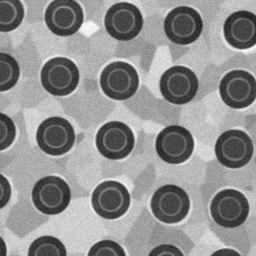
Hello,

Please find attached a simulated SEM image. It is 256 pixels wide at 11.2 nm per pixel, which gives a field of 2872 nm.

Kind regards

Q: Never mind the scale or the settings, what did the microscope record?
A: an array of small figures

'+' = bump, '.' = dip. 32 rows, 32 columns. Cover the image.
...+++....++++...+++++++++++++++
...+++.....++.....+++....++++..+
...+++.....++.....+++....+++....
..++++....+++.....+++....+++....
++++++++.+++++...++++....+++....
++++++++++++++++++++++..++++....
++++++++++++++++++++++++++++++++
..++++...+++++.+++++++++++++++++
..+++.....+++....++++...++++++++
...++.....++.....+++.....+++....
..+++.....++......++.....++.....
++++++...++++....+++.....++.....
++++++++++++++..+++++...++++....
+++++++++++++++++++++++++++++..+
.+++++++++++++++++++++++++++++++
..+++....++++...++++++++++++++++
..++.....+++.....+++....++++...+
..+++....+++.....++.....+++....+
.++++....+++.....++.....+++.....
++++++..+++++...++++....+++.....
++++++++++++++++++++++.+++++...+
++++++++++++++++++++++++++++++++
.++++...+++++.++++++++++++++++++
.+++.....+++....++++...+++++.+++
.+++.....++.....+++.....+++....+
.+++.....++.....+++.....++.....+
+++++...++++....+++.....++.....+
++++++++++++++++++++...++++....+
++++++++++++++++++++++++++++.+++
+++++.++++++++++++++++++++++++++
.+++....++++...+++++.+++++++++++
.++.....+++.....+++....++++...++